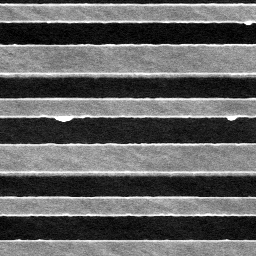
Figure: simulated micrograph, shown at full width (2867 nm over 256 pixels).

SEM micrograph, lines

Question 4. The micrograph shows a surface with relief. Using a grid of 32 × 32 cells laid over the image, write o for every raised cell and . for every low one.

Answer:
................................
oooooooooooooooooooooooooooooooo
oooooooooooooooooooooooooooooooo
................................
................................
................................
oooooooooooooooooooooooooooooooo
oooooooooooooooooooooooooooooooo
oooooooooooooooooooooooooooooooo
................................
................................
................................
oooooooooooooooooooooooooooooooo
oooooooooooooooooooooooooooooooo
oooooooooooooooooooooooooooooooo
................................
................................
................................
oooooooooooooooooooooooooooooooo
oooooooooooooooooooooooooooooooo
oooooooooooooooooooooooooooooooo
oooooooooooooooooooooooooooooooo
................................
................................
................................
oooooooooooooooooooooooooooooooo
oooooooooooooooooooooooooooooooo
................................
................................
................................
oooooooooooooooooooooooooooooooo
oooooooooooooooooooooooooooooooo